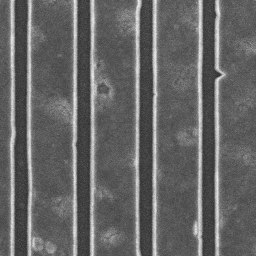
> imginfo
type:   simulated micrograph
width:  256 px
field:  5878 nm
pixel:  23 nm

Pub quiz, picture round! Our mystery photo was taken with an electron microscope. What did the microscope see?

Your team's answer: parallel lines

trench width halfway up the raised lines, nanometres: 376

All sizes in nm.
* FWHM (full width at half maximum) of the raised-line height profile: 1060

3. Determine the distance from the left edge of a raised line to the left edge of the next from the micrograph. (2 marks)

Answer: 1.44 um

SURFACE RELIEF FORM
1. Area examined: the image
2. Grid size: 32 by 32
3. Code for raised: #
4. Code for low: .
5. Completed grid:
##..#####...#####..######..#####
##..#####...#####..######..#####
##..#####...#####..######..#####
##..#####...#####..######..#####
##..#####...#####..######..#####
##..#####...#####..######..#####
##..#####...#####..######..#####
##..#####...#####..######..#####
##..#####...#####..######..#####
##..#####...#####..######...####
##..#####...#####..######..#####
##..#####...#####..######..#####
##..#####...#####..######..#####
##..#####...#####..######..#####
##..#####...#####..######..#####
##..#####...#####..######..#####
##..#####...#####..######..#####
##..#####...#####..######..#####
#...#####...#####..######..#####
#...#####...#####..######..#####
#...#####...#####..######..#####
#...#####...#####..######..#####
#...#####...#####..######..#####
#...#####...#####..######..#####
#...#####...#####..######..#####
#...#####...#####..######..#####
#...#####..######..######..#####
#...#####..######..######..#####
#...#####...#####..######..#####
#...#####...#####..######..#####
#...#####..######..######..#####
#...#####..######..######..#####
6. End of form